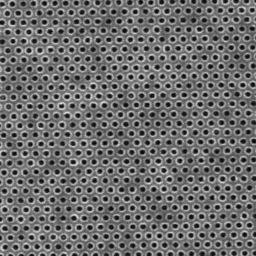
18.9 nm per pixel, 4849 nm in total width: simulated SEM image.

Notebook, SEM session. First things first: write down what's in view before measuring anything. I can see a regular array of holes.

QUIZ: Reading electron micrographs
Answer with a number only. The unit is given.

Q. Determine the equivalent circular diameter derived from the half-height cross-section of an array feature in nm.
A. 113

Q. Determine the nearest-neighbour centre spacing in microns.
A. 0.196